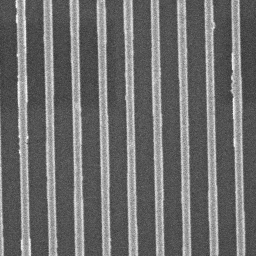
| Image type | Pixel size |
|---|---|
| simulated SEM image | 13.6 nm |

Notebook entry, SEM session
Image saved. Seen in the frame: parallel lines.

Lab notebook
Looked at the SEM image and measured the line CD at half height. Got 89.7 nm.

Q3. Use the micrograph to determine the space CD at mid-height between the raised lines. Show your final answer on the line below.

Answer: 273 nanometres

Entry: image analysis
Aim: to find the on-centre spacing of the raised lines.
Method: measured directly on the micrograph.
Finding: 364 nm